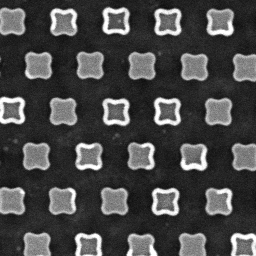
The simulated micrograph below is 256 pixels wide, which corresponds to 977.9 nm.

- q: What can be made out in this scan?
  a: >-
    a regular array of raised bodies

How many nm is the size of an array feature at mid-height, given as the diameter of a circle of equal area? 108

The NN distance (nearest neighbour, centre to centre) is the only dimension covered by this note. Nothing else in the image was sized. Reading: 194 nm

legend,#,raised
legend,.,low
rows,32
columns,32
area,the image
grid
................................
###....##....###...###....###...
###...####...###...###....###...
###...####...###...####...###...
................................
................................
................................
...###....###...###....###...###
...###....###...###....###...###
...###....###...###....###...###
................................
................................
###....##....###....##....###...
###...###....###...###....###...
###...####...###...###....###...
.......##....#.#....##....###...
................................
................................
...###....###...###....###...###
...###....###...###....###...###
...###....###...###....###...###
................................
................................
#...............................
###...###....###...###....###...
###...###....###...###....###...
###....##....###...###....###...
................................
................................
...###....##....###....##....###
...###....###...###....###...###
...###....###...###...####...###